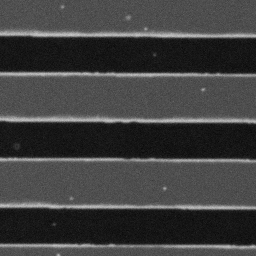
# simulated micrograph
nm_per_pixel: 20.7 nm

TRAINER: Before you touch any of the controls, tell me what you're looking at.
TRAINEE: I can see lines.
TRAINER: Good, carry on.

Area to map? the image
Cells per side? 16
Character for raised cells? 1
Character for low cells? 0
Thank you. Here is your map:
1111111111111111
1111111111111111
0000000000000000
0000000000000000
0000000000000000
1111111111111111
1111111111111111
1111111111111111
0000000000000000
0000000000000000
1111111111111111
1111111111111111
1111111111111111
0000000000000000
0000000000000000
1111111111111111